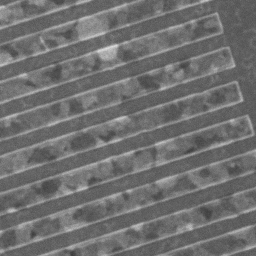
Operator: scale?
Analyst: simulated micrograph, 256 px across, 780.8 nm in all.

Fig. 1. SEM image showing parallel lines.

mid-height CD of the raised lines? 63.3 nanometers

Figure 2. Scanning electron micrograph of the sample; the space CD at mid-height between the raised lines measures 44.7 nanometres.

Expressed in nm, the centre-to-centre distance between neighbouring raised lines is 108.